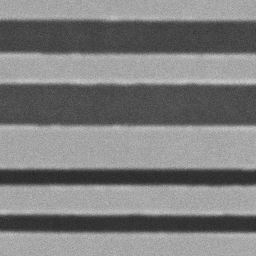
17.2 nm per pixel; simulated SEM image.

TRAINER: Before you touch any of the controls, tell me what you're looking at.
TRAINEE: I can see lines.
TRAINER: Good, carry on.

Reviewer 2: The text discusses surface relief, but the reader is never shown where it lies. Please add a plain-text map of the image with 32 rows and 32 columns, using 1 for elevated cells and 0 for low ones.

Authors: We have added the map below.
11111111111111111111111111111111
11111111111111111111111111111111
00000000000000000000000000000000
00000000000000000000000000000000
00000000000000000000000000000000
00000000000000000000000000000000
00000000000000000000000000000000
11111111111111111111111111111111
11111111111111111111111111111111
11111111111111111111111111111111
00000000000000000000000000000000
00000000000000000000000000000000
00000000000000000000000000000000
00000000000000000000000000000000
00000000000000000000000000000000
00000000000000000000000000000000
11111111111111111111111111111111
11111111111111111111111111111111
11111111111111111111111111111111
11111111111111111111111111111111
11111111111111111111111111111111
00000000000000000000000000000000
00000000000000000000000000000000
11111111111111111111111111111111
11111111111111111111111111111111
11111111111111111111111111111111
11111111111111111111111111111111
00000000000000000000000000000000
00000000000000000000000000000000
11111111111111111111111111111111
11111111111111111111111111111111
11111111111111111111111111111111